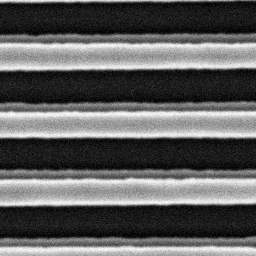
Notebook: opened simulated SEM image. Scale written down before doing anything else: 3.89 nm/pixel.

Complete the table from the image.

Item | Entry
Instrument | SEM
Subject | lines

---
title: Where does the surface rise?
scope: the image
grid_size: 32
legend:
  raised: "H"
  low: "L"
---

LLLLLLLLLLLLLLLLLLLLLLLLLLLLLLLL
LLLLLLLLLLLLLLLLLLLLLLLLLLLLLLLL
LLLLLLLLLLLLLLLLLLLLLLLLLLLLLLLL
LLLLLLLLLLLLLLLLLLLLLLLLLLLLLLLL
LLLLLLLLLLLLLLLLLLLLLLLLLLLLLLLL
HHHHHHHHHHHHHHHHLHHHHHHHLHHHHHHH
HHHHHHHHHHHHHHHHHHHHHHHHHHHHHHHH
HHHHHHHHHHHHHHHHHHHHHHHHHHHHHHHH
HHHHHHHHHHHHHHHHHHHHHHHHHHLLLLLL
LLLLLLLLLLLLLLLLLLLLLLLLLLLLLLLL
LLLLLLLLLLLLLLLLLLLLLLLLLLLLLLLL
LLLLLLLLLLLLLLLLLLLLLLLLLLLLLLLL
LLLLLLLLLLLLLLLLLLLLLLLLLLLLLLLL
LLLLLLLLLLLLLLLLLLLLLLLLLLLLLLLL
HHHHHHHHHHHHHHHHHHHHHHHHHHHHHHHH
HHHHHHHHHHHHHHHHHHHHHHHHHHHHHHHH
HHHHHHHHHHHHHHHHHHHHHHHHHHHHHHHH
LLLLLLLLLLLLLLLLLLLLLLLLLLLLLLLL
LLLLLLLLLLLLLLLLLLLLLLLLLLLLLLLL
LLLLLLLLLLLLLLLLLLLLLLLLLLLLLLLL
LLLLLLLLLLLLLLLLLLLLLLLLLLLLLLLL
LLLLLLLLLLLLLLLLLLLLLLLLLLLLLLLL
LLLLHLLLHLHHHLLHHHHHHHLHHHHHHHHH
HHHHHHHHHHHHHHHHHHHHHHHHHHHHHHHH
HHHHHHHHHHHHHHHHHHHHHHHHHHHHHHHH
HHHHHHHHHHHHHHHHHHHHHHLLHHLHHLLL
LLLLLLLLLLLLLLLLLLLLLLLLLLLLLLLL
LLLLLLLLLLLLLLLLLLLLLLLLLLLLLLLL
LLLLLLLLLLLLLLLLLLLLLLLLLLLLLLLL
LLLLLLLLLLLLLLLLLLLLLLLLLLLLLLLL
LLLLLLLLLLLLLLLLLLLLLLLLLLLLLLLL
HHHHHHHHHHHHHHHHHHHHHHHHHHHHHHHH